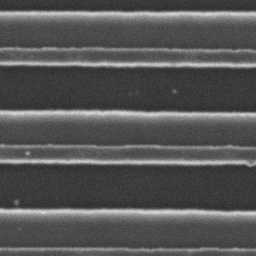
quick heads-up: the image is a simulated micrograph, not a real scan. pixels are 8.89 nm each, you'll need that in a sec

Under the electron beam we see lines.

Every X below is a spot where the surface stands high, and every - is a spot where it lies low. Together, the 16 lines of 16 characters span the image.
----------------
XXXXXXXXXXXXXXXX
XXXXXXXXXXXXXXXX
XXXXXXXXXXXXXXXX
----------------
----------------
----------------
XXXXXXXXXXXXXXXX
XXXXXXXXXXXXXXXX
XXXXXXXXXXXXXXXX
----------------
----------------
----------------
XXXXXXXXXXXXXXXX
XXXXXXXXXXXXXXXX
XXXXXXXXXXXXXXXX